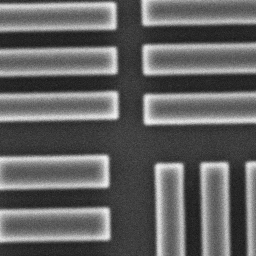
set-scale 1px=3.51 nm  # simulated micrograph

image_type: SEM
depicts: groups of lines, slits or small figures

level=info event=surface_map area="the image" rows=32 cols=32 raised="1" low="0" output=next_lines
00000000000011000011111111111111
11111111111111000011111111111111
11111111111111000011111111111111
11111111111111000000000000000000
00000000000000000000000000000000
00000000000000000000000000000000
11111111111111000011111111111111
11111111111111000011111111111111
11111111111111000011111111111111
00000000000000000000000000000000
00000000000000000000000000000000
00000000000000000000000000000000
11111111111111100011111111111111
11111111111111100011111111111111
11111111111111000011111111111111
00000000000000000000000000000000
00000000000000000000000000000000
00000000000000000000000000000000
00000000000000000000000000000000
00000000000000000000000000000000
11111111111110000000000000000001
11111111111110000000111001110001
11111111111110000000111001110001
00000000000000000000111001110001
00000000000000000000111001110001
00000000000000000000111001110001
11111111111110000000111001110001
11111111111111000000111001110001
11111111111111000000111001110001
11111111111110000000111001111001
00000000000000000000111001111001
00000000000000000000111001111001